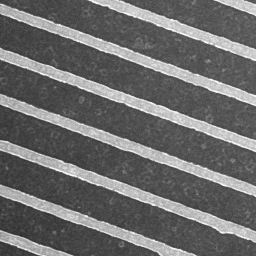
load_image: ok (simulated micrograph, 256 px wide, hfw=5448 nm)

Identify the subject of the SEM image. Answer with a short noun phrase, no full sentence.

parallel lines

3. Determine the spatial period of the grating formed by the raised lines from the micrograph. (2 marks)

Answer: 0.909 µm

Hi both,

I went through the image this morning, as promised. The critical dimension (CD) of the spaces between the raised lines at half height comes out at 696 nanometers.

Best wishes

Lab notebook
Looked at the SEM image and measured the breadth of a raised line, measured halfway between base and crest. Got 205 nanometres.